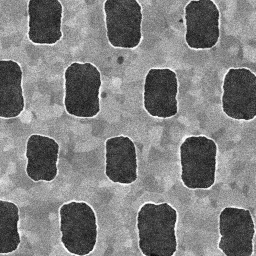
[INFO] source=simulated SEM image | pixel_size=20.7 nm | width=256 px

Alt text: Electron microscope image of holes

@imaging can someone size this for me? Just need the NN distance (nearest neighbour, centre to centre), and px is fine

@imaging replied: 78.2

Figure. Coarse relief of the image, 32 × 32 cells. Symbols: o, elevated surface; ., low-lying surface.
ooo.....ooooo....oooooo....ooooo
ooo.....ooooo.....ooooo....ooooo
oooo....ooooo.....oooo.....ooooo
oooo....ooooo.....ooooo....ooooo
oooo....ooooo.....ooooo....ooooo
ooooo.oooooooo...oooooo....ooooo
oooooooooooooooooooooooooooooooo
.ooooooooooooooooooooooooooooooo
...ooooo....ooooooooooo.oooooooo
...ooooo.....ooooo....oooooo....
...ooooo.....ooooo....oooooo....
...ooooo....oooooo....oooooo....
...ooooo....oooooo....oooooo....
...ooooo....oooooo....oooooo....
..ooooooo...ooooooo...ooooooo...
oooooooooooooooooooooooooooooooo
oooooooooooooooooooooooooooooooo
oooo...oooooo...ooooooo...oooooo
ooo....oooooo....oooooo....ooooo
ooo....oooooo....oooooo....ooooo
ooo....oooooo....oooooo....ooooo
ooo....oooooo....oooooo....ooooo
oooo..oooooooo...oooooo....ooooo
ooooooooooooooo.o.oooooo..oooooo
oooooooooooooooooooooooooooooooo
..oooooo...ooooooo...ooooooooooo
..ooooo.....ooooo.....oooooo...o
..oooooo....ooooo.....ooooo.....
..oooooo....ooooo.....ooooo.....
..oooooo....ooooo.....oooooo....
..oooooo....ooooo.....ooooo.....
.oooooooo..ooooooo....oooooo....